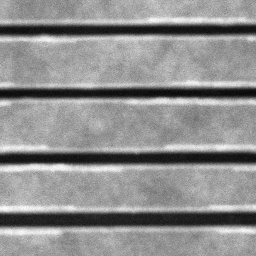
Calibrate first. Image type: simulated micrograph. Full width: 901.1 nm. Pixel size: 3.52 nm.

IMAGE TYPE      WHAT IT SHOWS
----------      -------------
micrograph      one or a few lines or trenches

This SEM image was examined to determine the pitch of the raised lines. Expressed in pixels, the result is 63.2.